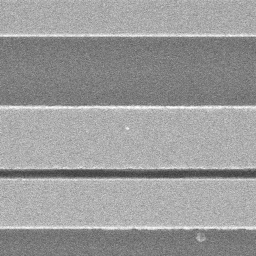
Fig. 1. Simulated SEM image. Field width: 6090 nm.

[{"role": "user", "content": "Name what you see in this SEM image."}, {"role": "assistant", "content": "lines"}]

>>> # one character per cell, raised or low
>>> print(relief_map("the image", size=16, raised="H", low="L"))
HHHHHHHHHHHHHHHH
HHHHHHHHHHHHHHHH
LLLLLLLLLLLLLLLL
LLLLLLLLLLLLLLLL
LLLLLLLLLLLLLLLL
LLLLLLLLLLLLLLLL
LLLLLLLLLLLLLLLL
HHHHHHHHHHHHHHHH
HHHHHHHHHHHHHHHH
HHHHHHHHHHHHHHHH
HHHHHHHHHHHHHHHH
HHHHHHHHHHHHHHHH
HHHHHHHHHHHHHHHH
HHHHHHHHHHHHHHHH
LLLLLLLLLLLLLLLL
LLLLLLLLLLLLLLLL